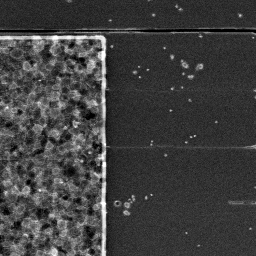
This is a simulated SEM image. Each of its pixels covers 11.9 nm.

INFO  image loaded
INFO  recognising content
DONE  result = wiring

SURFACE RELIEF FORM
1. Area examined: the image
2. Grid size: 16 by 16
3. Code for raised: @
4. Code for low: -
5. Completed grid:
----------------
----------------
@@@@@@----------
@@@@@@----------
@@@@@@@---------
@@@@@@@---------
@@@@@@----------
@@@@@@----------
@@@@@@----------
@@@@@@----------
@@@@@@@---------
@@@@@@@---------
@@@@@@----------
@@@@@@@---------
@@@@@@@---------
@@@@@@@---------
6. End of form